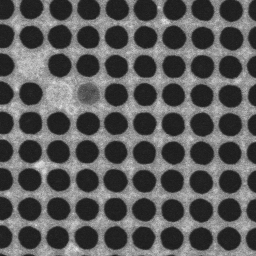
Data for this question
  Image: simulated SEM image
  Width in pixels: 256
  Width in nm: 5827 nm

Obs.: a regular array of holes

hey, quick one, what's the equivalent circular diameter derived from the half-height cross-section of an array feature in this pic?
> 544 nanometres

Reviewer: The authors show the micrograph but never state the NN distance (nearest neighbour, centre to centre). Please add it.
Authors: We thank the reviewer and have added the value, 640 nm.